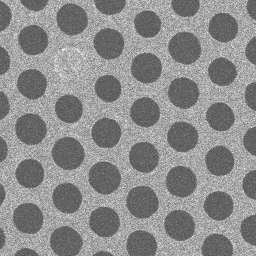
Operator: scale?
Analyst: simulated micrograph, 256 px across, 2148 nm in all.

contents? a regular array of holes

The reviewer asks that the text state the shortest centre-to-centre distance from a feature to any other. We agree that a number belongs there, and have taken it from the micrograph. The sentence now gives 363 nm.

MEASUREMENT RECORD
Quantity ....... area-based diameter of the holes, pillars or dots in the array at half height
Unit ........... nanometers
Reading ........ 255